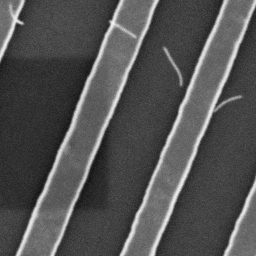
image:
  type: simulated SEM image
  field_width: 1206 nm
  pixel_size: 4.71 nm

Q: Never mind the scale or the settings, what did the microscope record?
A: lines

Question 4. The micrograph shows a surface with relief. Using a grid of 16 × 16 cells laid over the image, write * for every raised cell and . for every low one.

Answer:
*......***....**
*......**....**.
*......**....**.
......**.....**.
......**....**..
.....***....**..
.....**....**...
.....**....**...
....**.....**...
....**....**....
...***....**....
...**....**.....
..***....**....*
..**.....**....*
..**....**.....*
.***....**....**